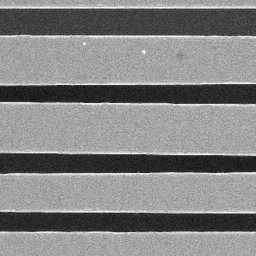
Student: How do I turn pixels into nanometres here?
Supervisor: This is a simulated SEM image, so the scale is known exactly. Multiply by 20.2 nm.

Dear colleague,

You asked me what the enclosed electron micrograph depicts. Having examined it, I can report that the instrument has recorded lines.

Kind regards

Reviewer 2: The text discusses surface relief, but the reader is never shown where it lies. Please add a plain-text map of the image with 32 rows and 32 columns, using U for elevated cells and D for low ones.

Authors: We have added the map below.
UUUUUUUUUUUUUUUUUUUUUUUUUUUUUUUU
DDDDDDDDDDDDDDDDDDDDDDDDDDDDDDDD
DDDDDDDDDDDDDDDDDDDDDDDDDDDDDDDD
DDDDDDDDDDDDDDDDDDDDDDDDDDDDDDDD
DDUUDDDDDDDDDDDDDDDDDDDDDDDDDDDD
UUUUUUUUUUUUUUUUUUUUUUUUUUUUUUUU
UUUUUUUUUUUUUUUUUUUUUUUUUUUUUUUU
UUUUUUUUUUUUUUUUUUUUUUUUUUUUUUUU
UUUUUUUUUUUUUUUUUUUUUUUUUUUUUUUU
UUUUUUUUUUUUUUUUUUUUUUUUUUUUUUUU
UUUUUUUUUUUUUUUUUUUUUUUUUUDDDDDD
DDDDDDDDDDDDDDDDDDDDDDDDDDDDDDDD
DDDDDDDDDDDDDDDDDDDDDDDDDDDDDDDD
UUUUUUUUUUUUUUUUUUUUUUUUUUUUUUUU
UUUUUUUUUUUUUUUUUUUUUUUUUUUUUUUU
UUUUUUUUUUUUUUUUUUUUUUUUUUUUUUUU
UUUUUUUUUUUUUUUUUUUUUUUUUUUUUUUU
UUUUUUUUUUUUUUUUUUUUUUUUUUUUUUUU
UUUUUUUUUUUUUUUUUUUUUUUUUUUUUUUU
DDDDDDDDDDDDDDDDDDDDDDDDDDDDDDDD
DDDDDDDDDDDDDDDDDDDDDDDDDDDDDDDD
DDDDDDDDDDDDDDDDDDDDDDDDDDDDDDDD
UUUUUUUUUUUUUUUUUUUUUUUUUUUUUUUU
UUUUUUUUUUUUUUUUUUUUUUUUUUUUUUUU
UUUUUUUUUUUUUUUUUUUUUUUUUUUUUUUU
UUUUUUUUUUUUUUUUUUUUUUUUUUUUUUUU
DDDDDDDDDDDDDDDDDDDDUUUUUUUUUUUU
DDDDDDDDDDDDDDDDDDDDDDDDDDDDDDDD
DDDDDDDDDDDDDDDDDDDDDDDDDDDDDDDD
UUUUUUUUUUUUUUUUUUUUUUUUUUUUUUUU
UUUUUUUUUUUUUUUUUUUUUUUUUUUUUUUU
UUUUUUUUUUUUUUUUUUUUUUUUUUUUUUUU